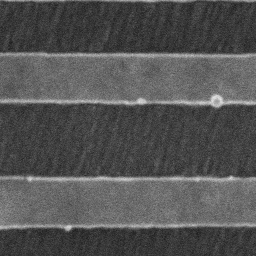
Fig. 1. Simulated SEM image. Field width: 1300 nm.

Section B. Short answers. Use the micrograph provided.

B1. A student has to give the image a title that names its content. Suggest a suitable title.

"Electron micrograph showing lines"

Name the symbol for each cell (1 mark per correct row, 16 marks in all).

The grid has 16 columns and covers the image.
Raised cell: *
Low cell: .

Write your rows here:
................
................
................
****************
****************
****************
.......**..*****
................
................
................
................
****************
****************
****************
................
................